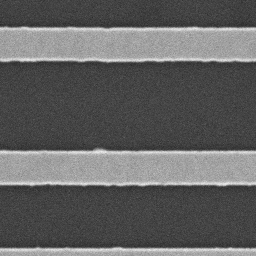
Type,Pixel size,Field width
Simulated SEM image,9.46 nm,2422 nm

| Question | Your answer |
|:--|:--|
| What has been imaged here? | lines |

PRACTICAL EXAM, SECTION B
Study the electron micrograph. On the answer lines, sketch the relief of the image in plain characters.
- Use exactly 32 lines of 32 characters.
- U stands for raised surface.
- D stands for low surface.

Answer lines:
DDDDDDDDDDDDDDDDDDDDDDDDDDDDDDDD
DDDDDDDDDDDDDDDDDDDDDDDDDDDDDDDD
DDDDDDDDDDDDDDDDDDDDDDDDDDDDDDDD
DDUUDDDDDDDDDDDDDDDDDDDDDDDDDDDD
UUUUUUUUUUUUUUUUUUUUUUUUUUUUUUUU
UUUUUUUUUUUUUUUUUUUUUUUUUUUUUUUU
UUUUUUUUUUUUUUUUUUUUUUUUUUUUUUUU
UUUUUDUUUUUUUUUUUUUUUUUUUUUUUUUU
DDDDDDDDDDDDDDDDDDDDDDDDDDDDDDDD
DDDDDDDDDDDDDDDDDDDDDDDDDDDDDDDD
DDDDDDDDDDDDDDDDDDDDDDDDDDDDDDDD
DDDDDDDDDDDDDDDDDDDDDDDDDDDDDDDD
DDDDDDDDDDDDDDDDDDDDDDDDDDDDDDDD
DDDDDDDDDDDDDDDDDDDDDDDDDDDDDDDD
DDDDDDDDDDDDDDDDDDDDDDDDDDDDDDDD
DDDDDDDDDDDDDDDDDDDDDDDDDDDDDDDD
DDDDDDDDDDDDDDDDDDDDDDDDDDDDDDDD
DDDDDDDDDDDDDDDDDDDDDDDDDDDDDDDD
DDDDDDDDDDDDDDDDDDDDDDDDDDDDDDDD
UUUUUUUUUUUUUUUUUUUUUUUUUUUUUUUU
UUUUUUUUUUUUUUUUUUUUUUUUUUUUUUUU
UUUUUUUUUUUUUUUUUUUUUUUUUUUUUUUU
UUUUUUUUUUUUUUUUUUUUUUUUUUUUUUUU
DDDDDDDDDDDDDDDDDDDDDDDDDDDDDDDD
DDDDDDDDDDDDDDDDDDDDDDDDDDDDDDDD
DDDDDDDDDDDDDDDDDDDDDDDDDDDDDDDD
DDDDDDDDDDDDDDDDDDDDDDDDDDDDDDDD
DDDDDDDDDDDDDDDDDDDDDDDDDDDDDDDD
DDDDDDDDDDDDDDDDDDDDDDDDDDDDDDDD
DDDDDDDDDDDDDDDDDDDDDDDDDDDDDDDD
DDDDDDDDDDDDDDDDDDDDDDDDDDDDDDDD
UUUUUUUUUUUUUUUUUUUUUUUUUUUUUUUU